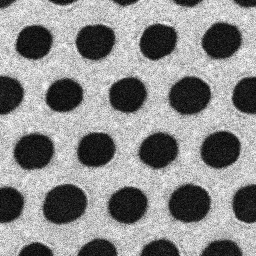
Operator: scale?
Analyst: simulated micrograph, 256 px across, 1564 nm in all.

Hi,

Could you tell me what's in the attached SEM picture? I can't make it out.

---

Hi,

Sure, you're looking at a regular array of holes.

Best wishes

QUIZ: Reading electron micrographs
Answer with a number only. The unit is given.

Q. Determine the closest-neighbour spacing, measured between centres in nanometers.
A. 376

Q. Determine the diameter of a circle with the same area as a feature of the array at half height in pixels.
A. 38.2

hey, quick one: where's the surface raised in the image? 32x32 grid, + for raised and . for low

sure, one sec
.++++++..++++++..+++++...+++++..
++++++++++++++++++++++++++++++++
++++++++++++++++++++++++++++++++
+++...++++....++++....++++....++
++.....+++....++++....+++.....++
++.....++.....+++.....+++.....++
++....++++....++++....++++...+++
+++++++++++.+++++++.++++++++++++
++++++++++++++++++++++++++++++++
.+++++++++++++++++++++++++++++++
...++++...++++....++++....++++..
...+++....++++....+++.....+++...
...+++....++++....+++.....+++...
..++++...+++++...+++++....++++..
++++++++++++++++++++++++++++++++
++++++++++++++++++++++++++++++++
+++++++++++++++++++++++++++..+++
++....++++....++++....++++....++
++.....+++....+++.....+++.....++
++.....+++....+++.....+++.....++
++....++++...+++++...+++++...+++
++++++++++++++++++++++++++++++++
++++++++++++++++++++++++++++++++
..+++++...+++++..+++++...+++++..
...+++.....+++....+++.....+++...
...++......++.....+++.....+++...
...++......+++....+++.....+++...
..++++...+++++...+++++...+++++..
++++++++++++++++++++++++++++++++
++++++++++++++++++++++++++++++++
++++.++++++...+++++...++++....++
++....++++.....+++....+++.....++